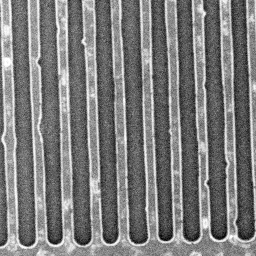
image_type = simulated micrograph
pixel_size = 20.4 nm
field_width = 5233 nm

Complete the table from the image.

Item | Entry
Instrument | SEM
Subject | parallel lines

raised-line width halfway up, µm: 0.186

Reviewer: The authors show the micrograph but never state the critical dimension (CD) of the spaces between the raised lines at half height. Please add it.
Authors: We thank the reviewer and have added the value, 0.373 um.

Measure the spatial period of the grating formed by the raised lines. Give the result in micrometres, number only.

0.561